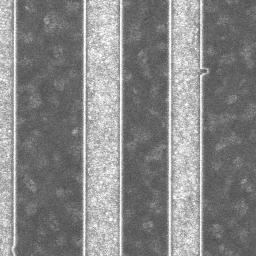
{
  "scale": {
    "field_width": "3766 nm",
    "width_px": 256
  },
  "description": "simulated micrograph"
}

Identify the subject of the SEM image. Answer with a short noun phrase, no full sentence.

one or a few lines or trenches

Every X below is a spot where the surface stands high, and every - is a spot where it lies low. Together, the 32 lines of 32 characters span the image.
--XXXXXXXXX----XXXXXX----XXXXXXX
--XXXXXXXXX----XXXXXX----XXXXXXX
--XXXXXXXXX----XXXXXX----XXXXXXX
--XXXXXXXXX----XXXXXX----XXXXXXX
--XXXXXXXXX----XXXXXX----XXXXXXX
--XXXXXXXXX----XXXXXX----XXXXXXX
--XXXXXXXXX----XXXXXX----XXXXXXX
--XXXXXXXXX----XXXXXX----XXXXXXX
--XXXXXXXXX----XXXXXX----XXXXXXX
--XXXXXXXXX----XXXXXX----XXXXXXX
--XXXXXXXXX----XXXXXX----XXXXXXX
--XXXXXXXXX----XXXXXX----XXXXXXX
--XXXXXXXXX----XXXXXX----XXXXXXX
--XXXXXXXXX----XXXXXX----XXXXXXX
--XXXXXXXXX----XXXXXX----XXXXXXX
--XXXXXXXXX----XXXXXX----XXXXXXX
--XXXXXXXXX----XXXXXX----XXXXXXX
--XXXXXXXXX----XXXXXX----XXXXXXX
--XXXXXXXXX----XXXXXX----XXXXXXX
--XXXXXXXXX----XXXXXX----XXXXXXX
--XXXXXXXXX----XXXXXX----XXXXXXX
--XXXXXXXXX----XXXXXX----XXXXXXX
--XXXXXXXXX----XXXXXX----XXXXXXX
--XXXXXXXXX----XXXXXX----XXXXXXX
--XXXXXXXXX----XXXXXX----XXXXXXX
--XXXXXXXXX----XXXXXX----XXXXXXX
--XXXXXXXXX----XXXXXX----XXXXXXX
--XXXXXXXXX----XXXXXX----XXXXXXX
--XXXXXXXXX----XXXXXX----XXXXXXX
--XXXXXXXXX----XXXXXX----XXXXXXX
--XXXXXXXXX----XXXXXX----XXXXXXX
--XXXXXXXXX----XXXXXX----XXXXXXX